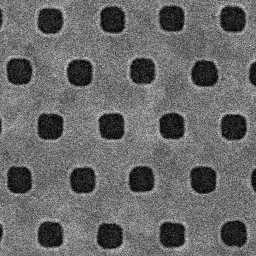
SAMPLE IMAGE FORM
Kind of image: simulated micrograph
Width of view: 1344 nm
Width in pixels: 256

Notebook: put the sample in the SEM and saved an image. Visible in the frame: a regular array of holes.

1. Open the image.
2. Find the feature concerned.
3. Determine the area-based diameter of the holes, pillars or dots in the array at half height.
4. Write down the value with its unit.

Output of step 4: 0.155 µm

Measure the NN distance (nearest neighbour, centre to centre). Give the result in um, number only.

0.316